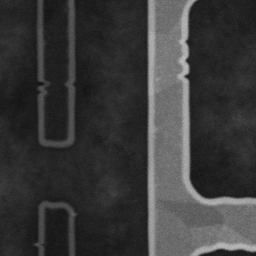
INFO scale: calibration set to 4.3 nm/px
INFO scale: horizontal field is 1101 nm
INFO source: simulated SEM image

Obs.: one or a few lines or trenches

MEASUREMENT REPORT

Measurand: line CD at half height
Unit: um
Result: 0.139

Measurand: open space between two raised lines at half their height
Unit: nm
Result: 346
